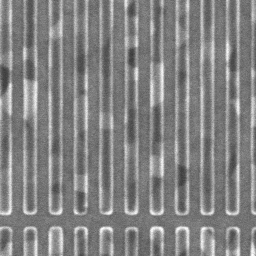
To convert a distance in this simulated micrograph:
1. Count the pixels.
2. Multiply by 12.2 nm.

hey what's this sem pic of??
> wiring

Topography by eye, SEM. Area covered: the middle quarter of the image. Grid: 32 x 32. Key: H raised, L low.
LLLHHHLLLHHHLLLHHHLLLLHHHLLLHHHL
LLLHHHLLLHHHLLLHHHLLLLHHHLLLHHHL
LLLHHHLLLHHHLLLHHHLLLLHHHLLLHHHL
LLLHHHLLLHHHLLLHHHLLLLHHHLLLHHHL
LLLHHHLLLHHHLLLHHHLLLLHHHLLLHHHL
LLLHHHLLLHHHLLLHHHLLLLHHHLLLHHHL
LLLHHHLLLHHHLLLHHHLLLLHHHLLLHHHL
LLLHHHLLLHHHLLLHHHLLLLHHHLLLHHHL
LLLHHHLLLHHHLLLHHHLLLLHHHLLLHHHL
LLLHHHLLLHHHLLLHHHLLLLHHHLLLHHHL
LLLHHHLLLHHHLLLHHHLLLLHHHLLLHHHL
LLLHHHLLLHHHLLLHHHLLLLHHHLLLHHHL
LLLHHHLLLHHHLLLHHHLLLLHHHLLLHHHL
LLLHHHLLLHHHLLLHHHLLLLHHHLLLHHHL
LLLHHHLLLHHHLLLHHHLLLLHHHLLLHHHL
LLLHHHLLLHHHLLLHHHLLLLHHHLLLHHHL
LLLHHHLLLHHHLLLHHHLLLLHHHLLLHHHL
LLLHHHLLLHHHLLLHHHLLLLHHHLLLHHHL
LLLHHHLLLHHHLLLHHHLLLLHHHLLLHHHL
LLLHHHLLLHHHLLLHHHLLLLHHHLLLHHHL
LLLHHHLLLHHHLLLHHHLLLLHHHLLLHHHL
LLLHHHLLLHHHLLLHHHLLLLHHHLLLHHHL
LLLHHHLLLHHHLLLHHHLLLLHHHLLLHHHL
LLLHHHLLLHHHLLLHHHLLLLHHHLLLHHHL
LLLHHHLLLHHHLLLHHHLLLLHHHLLLHHHL
LLLHHHLLLHHHLLLHHHLLLLHHHLLLHHHL
LLLHHHLLLHHHLLLHHHLLLLHHHLLLHHHL
LLLHHHLLLHHHLLLHHHLLLLHHHLLLHHHL
LLLHHHLLLHHHLLLHHHLLLLHHHLLLHHHL
LLLHHHLLLHHHLLLHHHLLLLHHHLLLHHHL
LLLHHHLLLHHHLLLHHHLLLLHHHLLLHHHL
LLLHHHLLLHHHLLLHHHLLLLHHHLLLHHHL